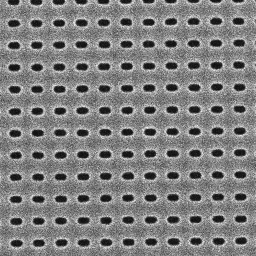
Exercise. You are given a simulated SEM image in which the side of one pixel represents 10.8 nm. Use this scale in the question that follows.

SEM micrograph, a regular array of holes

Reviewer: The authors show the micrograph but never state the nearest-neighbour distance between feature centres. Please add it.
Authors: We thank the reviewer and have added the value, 0.236 microns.